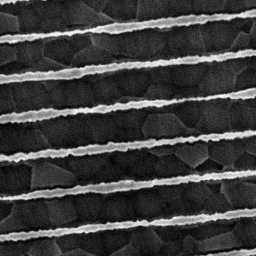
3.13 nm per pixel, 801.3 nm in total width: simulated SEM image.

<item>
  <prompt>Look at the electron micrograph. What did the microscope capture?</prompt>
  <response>parallel lines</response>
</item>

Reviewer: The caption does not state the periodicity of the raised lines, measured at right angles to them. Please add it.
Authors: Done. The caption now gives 123 nm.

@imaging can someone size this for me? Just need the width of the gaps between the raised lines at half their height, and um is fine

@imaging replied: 0.102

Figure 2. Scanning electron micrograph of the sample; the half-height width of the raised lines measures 21 nanometres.